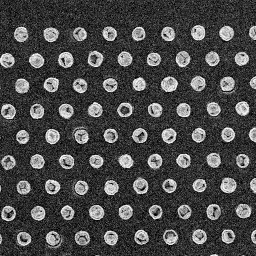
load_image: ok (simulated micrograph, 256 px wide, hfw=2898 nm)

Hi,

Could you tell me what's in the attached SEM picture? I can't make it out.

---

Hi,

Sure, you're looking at a regular array of raised bodies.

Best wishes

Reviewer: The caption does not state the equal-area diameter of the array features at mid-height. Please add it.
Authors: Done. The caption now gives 0.146 microns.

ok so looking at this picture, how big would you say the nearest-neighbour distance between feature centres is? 318 nanometres